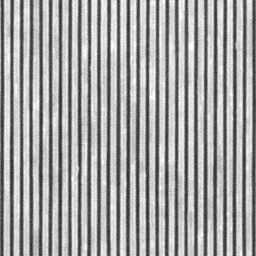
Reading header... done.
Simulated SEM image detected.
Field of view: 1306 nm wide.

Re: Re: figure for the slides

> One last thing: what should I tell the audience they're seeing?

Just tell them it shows parallel lines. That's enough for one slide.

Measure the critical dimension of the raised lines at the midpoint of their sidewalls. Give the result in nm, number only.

28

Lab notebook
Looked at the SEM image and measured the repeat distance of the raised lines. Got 49.4 nanometres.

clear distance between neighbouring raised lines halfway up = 23.6 nm